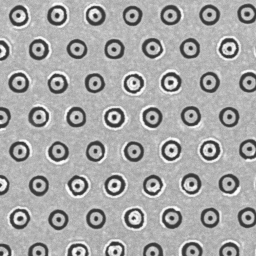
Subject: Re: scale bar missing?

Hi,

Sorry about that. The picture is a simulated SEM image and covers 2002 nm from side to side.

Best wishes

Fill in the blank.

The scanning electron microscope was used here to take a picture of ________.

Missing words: a regular array of ring-shaped grooves with a dot in the middle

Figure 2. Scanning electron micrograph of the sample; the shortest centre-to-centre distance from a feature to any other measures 296 nanometres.